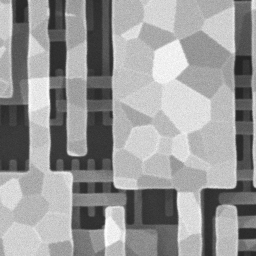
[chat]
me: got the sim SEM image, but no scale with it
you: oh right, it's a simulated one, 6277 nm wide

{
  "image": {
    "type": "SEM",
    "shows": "wiring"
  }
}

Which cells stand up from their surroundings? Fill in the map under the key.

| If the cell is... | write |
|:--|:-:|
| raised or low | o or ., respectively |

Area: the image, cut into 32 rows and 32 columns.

o...oo..ooo...ooooooooooooooo..o
o...oo..ooo...ooooooooooooooo..o
o...oo..ooo...ooooooooooooooo..o
o...oo..ooo...ooooooooooooooo...
o...oo..ooo...ooooooooooooooo...
o...oo..ooo...ooooooooooooooo...
o...oo..ooo...ooooooooooooooo...
o...oo..ooo...ooooooooooooooo...
o...oo..ooo...ooooooooooooooo...
o...oo..ooo...ooooooooooooooo...
o...oo..ooo...ooooooooooooooo..o
o...oo..ooo...ooooooooooooooo...
....oo..ooo...ooooooooooooooo...
....oo..ooo...ooooooooooooooo...
....oo..ooo...ooooooooooooooo...
....oo..ooo...ooooooooooooooo...
....oo..ooo...ooooooooooooooo...
....oo..ooo...ooooooooooooooo...
....oo..ooo...ooooooooooooooo...
....oo........ooooooooooooooo...
....oo........ooooooooooooooo...
...ooooo......ooooooooooooooo...
ooooooooo.....ooooooooooooooo...
ooooooooo......oooo..ooooo......
ooooooooo.............ooo.......
ooooooooo.............ooo.......
ooooooooo....oo.......ooo..ooo..
ooooooooo....ooo......ooo..ooo..
ooooooooo....ooo......ooo..ooo..
ooooooooo....ooo......ooo..ooo..
ooooooooo....ooo......ooo..ooo..
ooooooooo....ooo......ooo..ooo..